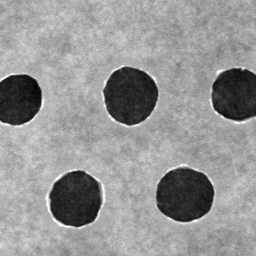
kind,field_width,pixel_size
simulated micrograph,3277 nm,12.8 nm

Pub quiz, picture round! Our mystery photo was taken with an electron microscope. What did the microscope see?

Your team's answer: holes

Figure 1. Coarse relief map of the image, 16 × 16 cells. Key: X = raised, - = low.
XXXXXXXXXXXXXXXX
XXXXXXXXXXXXXXXX
XXXXXXXXXXXXXXXX
XXXXXXXXXXXXXXXX
XXXXXXX--XXXXX--
---XXXX---XXX---
---XXXX---XXX---
--XXXXX--XXXXXXX
XXXXXXXXXXXXXXXX
XXXXXXXXXXXXXXXX
XXXXXXXXXXX-XXXX
XXX---XXXX---XXX
XXX---XXXX---XXX
XXX---XXXX---XXX
XXXXXXXXXXXXXXXX
XXXXXXXXXXXXXXXX